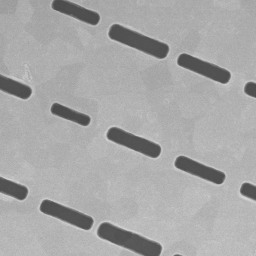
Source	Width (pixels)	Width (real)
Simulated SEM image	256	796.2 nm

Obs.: holes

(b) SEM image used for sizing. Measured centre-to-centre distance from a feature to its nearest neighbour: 220 nanometres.